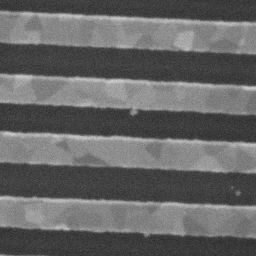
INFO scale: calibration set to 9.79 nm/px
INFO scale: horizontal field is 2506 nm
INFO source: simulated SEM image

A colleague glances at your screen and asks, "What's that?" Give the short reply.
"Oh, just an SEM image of lines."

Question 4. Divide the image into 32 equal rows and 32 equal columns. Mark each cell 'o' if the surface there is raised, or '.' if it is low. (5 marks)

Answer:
................................
o...............................
ooooooooooooooooooooooo.........
oooooooooooooooooooooooooooooooo
oooooooooooooooooooooooooooooooo
.......ooooooooooooooooooooooooo
.............................ooo
................................
................................
ooo.............................
ooooooooooooooooooooooooo.......
oooooooooooooooooooooooooooooooo
oooooooooooooooooooooooooooooooo
................oooooooooooooooo
................................
................................
o...............................
oooooooooooooooooooo.o..........
oooooooooooooooooooooooooooooooo
oooooooooooooooooooooooooooooooo
......oooooooooooooooooooooooooo
..............................oo
................................
................................
................................
ooooooooooooooooooooooo.........
oooooooooooooooooooooooooooooooo
oooooooooooooooooooooooooooooooo
.....ooooooooooooooooooooooooooo
..........................o..ooo
................................
................................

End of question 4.